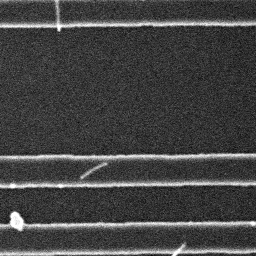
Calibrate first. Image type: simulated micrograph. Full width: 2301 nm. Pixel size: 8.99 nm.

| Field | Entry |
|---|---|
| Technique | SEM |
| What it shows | lines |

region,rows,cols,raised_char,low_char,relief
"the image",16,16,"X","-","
XXXXXXXXXXXXXXXX
XXXXXXXXXXXXXXXX
----------------
----------------
----------------
----------------
----------------
----------------
----------------
----------------
XXXXXXXXXXXXXXXX
XXXXXXXXXXXXXXXX
----------------
----------------
XXXXXXXXXXXXXXXX
XXXXXXXXXXXXXXXX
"